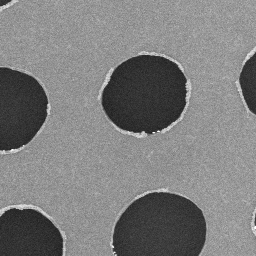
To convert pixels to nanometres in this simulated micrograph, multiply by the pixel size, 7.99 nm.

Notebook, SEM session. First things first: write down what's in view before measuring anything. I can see holes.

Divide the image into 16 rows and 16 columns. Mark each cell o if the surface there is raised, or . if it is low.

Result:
oooooooooooooooo
oooooooooooooooo
oooooooooooooooo
ooooooooo.oooooo
.oooooo....oooo.
...oooo.....ooo.
...ooo......ooo.
...oooo....ooooo
..oooooooooooooo
oooooooooooooooo
oooooooooooooooo
oooooooooooooooo
ooooooooo...oooo
...ooooo.....ooo
....ooo......ooo
....ooo......ooo